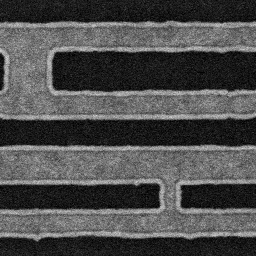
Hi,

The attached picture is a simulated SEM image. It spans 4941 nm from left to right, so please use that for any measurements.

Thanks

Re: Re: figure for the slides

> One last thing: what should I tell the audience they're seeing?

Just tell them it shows one or a few lines or trenches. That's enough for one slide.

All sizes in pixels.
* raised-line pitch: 61.9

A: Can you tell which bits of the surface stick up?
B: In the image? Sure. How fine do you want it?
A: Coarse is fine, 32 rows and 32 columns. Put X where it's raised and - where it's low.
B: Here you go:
--------------------------------
--------------------------------
--------------------------------
XXXXXXXXXXXXXXXXXXXXXXXXXXXXXXXX
XXXXXXXXXXXXXXXXXXXXXXXXXXXXXXXX
XXXXXXXXXXXXXXXXXXXXXXXXXXXXXXXX
XXXXXXX-------------------------
-XXXXX--------------------------
-XXXXX--------------------------
-XXXXX--------------------------
-XXXXX--------------------------
XXXXXXX--------------------X----
XXXXXXXXXXXXXXXXXXXXXXXXXXXXXXXX
XXXXXXXXXXXXXXXXXXXXXXXXXXXXXXXX
XXXXXXXXXX-XXXXXXXXXXXXXXXXX-XX-
--------------------------------
--------------------------------
--------------------------------
------------------------------XX
XXXXXXXXXXXXXXXXXXXXXXXXXXXXXXXX
XXXXXXXXXXXXXXXXXXXXXXXXXXXXXXXX
XXXXXXXXXXXXXXXXXXXXXXXXXXXXXXXX
XXXXXXXXXXXXXXXXXXXXXXXXXXXXXXXX
--------------------XX----------
--------------------XX----------
--------------------XX----------
---------------XXXXXXXXXXXXXXXXX
XXXXXXXXXXXXXXXXXXXXXXXXXXXXXXXX
XXXXXXXXXXXXXXXXXXXXXXXXXXXXXXXX
----X---------------------------
--------------------------------
--------------------------------